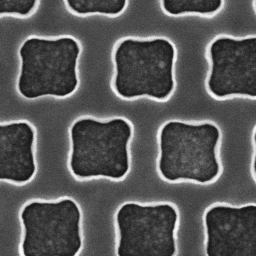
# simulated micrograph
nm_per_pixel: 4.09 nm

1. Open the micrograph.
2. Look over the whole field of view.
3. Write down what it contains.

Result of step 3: holes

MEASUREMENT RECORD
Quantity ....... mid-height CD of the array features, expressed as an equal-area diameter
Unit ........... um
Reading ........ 0.26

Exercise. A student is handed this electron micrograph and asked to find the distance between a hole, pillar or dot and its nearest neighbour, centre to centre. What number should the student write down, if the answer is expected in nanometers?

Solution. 368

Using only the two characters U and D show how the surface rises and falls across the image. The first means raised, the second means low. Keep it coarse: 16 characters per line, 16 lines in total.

DDUUUDDDUUDDDDUU
UUUUUUUUUUUUUUUU
UUDDUUUUDDUUUUDD
UDDDDUUDDDDUUDDD
UDDDDUUDDDDUUDDD
UDDDDUUDDDDUUDDD
UUUUUUUUUUUUUUUU
UUUUUDUDUUUUUUUU
DDUUDDDDUUDDDDUU
DDUUDDDDUUDDDDUU
DDUUUDDDUUDDDDUU
UUUUUUUUUUUUUUUU
UUUUUUUUUUUUUUUU
UDDDDUUDDDDUUDDD
UDDDDUUDDDDUUDDD
UDDDDUUDDDDUUDDD